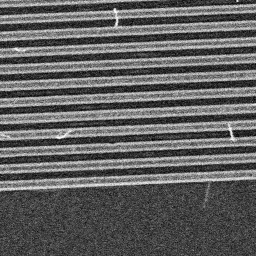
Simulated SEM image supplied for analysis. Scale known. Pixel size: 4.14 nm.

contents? parallel lines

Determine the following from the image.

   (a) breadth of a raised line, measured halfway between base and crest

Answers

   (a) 0.029 microns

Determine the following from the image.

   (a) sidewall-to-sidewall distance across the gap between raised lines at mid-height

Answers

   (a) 39.3 nanometers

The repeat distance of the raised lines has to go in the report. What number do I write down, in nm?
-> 68.8